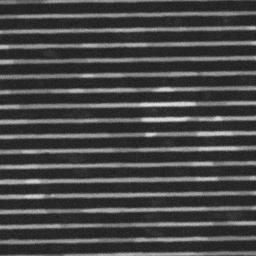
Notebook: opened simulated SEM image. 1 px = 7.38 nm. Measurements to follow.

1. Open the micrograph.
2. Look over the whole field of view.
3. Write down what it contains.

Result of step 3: parallel lines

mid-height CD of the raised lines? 19.4 nanometres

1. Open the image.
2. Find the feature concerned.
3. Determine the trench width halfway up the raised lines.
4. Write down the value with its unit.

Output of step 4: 90.3 nanometers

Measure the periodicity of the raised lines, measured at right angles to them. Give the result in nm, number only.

111